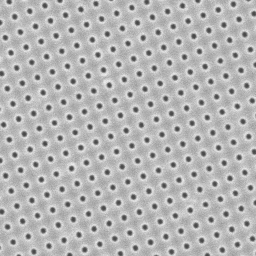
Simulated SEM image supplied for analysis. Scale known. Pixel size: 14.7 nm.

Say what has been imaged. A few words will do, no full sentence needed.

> a regular array of holes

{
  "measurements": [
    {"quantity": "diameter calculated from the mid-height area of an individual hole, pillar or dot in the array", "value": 88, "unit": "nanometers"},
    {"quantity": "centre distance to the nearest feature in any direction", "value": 235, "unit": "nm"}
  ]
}